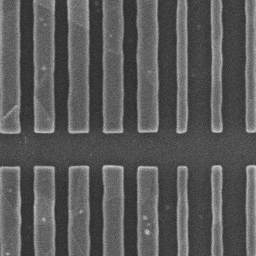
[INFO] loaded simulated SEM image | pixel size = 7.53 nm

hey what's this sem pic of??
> groups of lines, slits or small figures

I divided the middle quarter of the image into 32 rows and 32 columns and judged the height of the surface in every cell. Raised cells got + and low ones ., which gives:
.+++++....+++++...+++++.....+++.
.+++++....+++++....++++......++.
.+++++....+++++....++++......++.
.+++++....+++++....++++......++.
..++++....+++++....++++......++.
..++++....+++++....++++......++.
.+++++....+++++....++++......++.
.+++++....+++++...+++++......++.
.+++++....+++++...+++++......++.
.+++++....+++++...+++++......++.
.+++++....+++++...+++++......++.
.+++++....+++++....++++......++.
.+++++....+++++....++++.....+++.
.+++++....++++.....++++.....+++.
.+++++....++++.....++++......++.
.+++++....++++.....++++.....++..
.+++++....++++.....++++.....++..
................................
................................
................................
................................
................................
................................
................................
................................
................................
.+++++....+++++....++++......++.
.+++++....+++++...+++++......++.
.+++++....+++++...+++++......++.
.+++++....+++++...+++++......++.
.+++++....+++++....++++......+..
.+++++....+++++....++++......++.